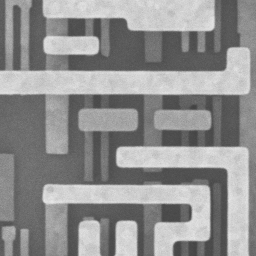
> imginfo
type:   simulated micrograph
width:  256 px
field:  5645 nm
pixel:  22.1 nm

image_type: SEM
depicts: wiring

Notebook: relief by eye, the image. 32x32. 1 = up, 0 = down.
00000111111111111111111111100000
00000111111111111111111111100000
00000000000000001111111111100000
00000000000000001111111111100000
00000000000000000000000000000000
00000111111100000000000000000000
00000011111100000000000000001110
00000000000000000000000000001110
00000000000000000000000000001110
11111111111111111111111111111110
11111111111111111111111111111110
11111111111111111111111111111110
00000000000000000000000000000000
00000000000000000000000000000000
00000000001111111001111111000000
00000000001111111001111111000000
00000000000000000000000000000000
00000000000000000000000000000000
00000000000000011111111111111110
00000000000000011111111111111110
00000000000000011111111111111110
00000000000000000000000000001110
00000000000000000000000000001110
00000111111111111111111111001110
00000111111111111111111111001110
00000000000000000000000111001110
00000000000000000000000011001110
00000000000000000000000011001110
00000000001100011001111111001110
00000000001100011001111111001110
00000000001100011001110000001110
00000000001110011001110000001110